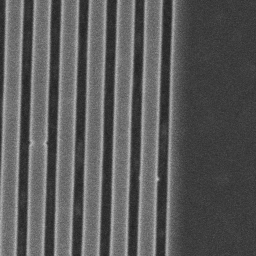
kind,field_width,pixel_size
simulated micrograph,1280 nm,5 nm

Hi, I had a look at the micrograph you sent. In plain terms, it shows parallel lines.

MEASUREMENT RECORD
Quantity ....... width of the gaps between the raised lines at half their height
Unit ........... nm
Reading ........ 52.4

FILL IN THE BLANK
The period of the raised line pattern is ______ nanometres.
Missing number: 139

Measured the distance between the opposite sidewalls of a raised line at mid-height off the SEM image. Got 84.9 nanometers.